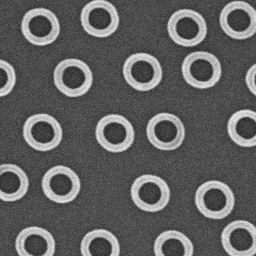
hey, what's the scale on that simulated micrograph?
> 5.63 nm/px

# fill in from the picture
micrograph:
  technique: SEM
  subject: a regular array of ring-shaped raised bodies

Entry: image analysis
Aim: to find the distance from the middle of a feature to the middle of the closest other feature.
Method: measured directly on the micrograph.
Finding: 0.314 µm